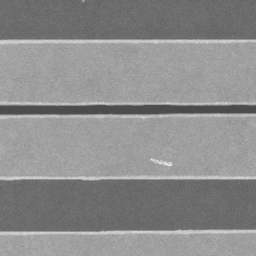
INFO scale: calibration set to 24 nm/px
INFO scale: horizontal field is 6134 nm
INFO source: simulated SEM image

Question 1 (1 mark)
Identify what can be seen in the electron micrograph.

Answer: lines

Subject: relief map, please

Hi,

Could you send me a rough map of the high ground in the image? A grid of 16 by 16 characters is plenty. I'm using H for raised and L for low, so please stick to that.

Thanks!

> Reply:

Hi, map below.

LLLLLLLLLLLLLLLL
LLLLLLLLLLLLLLLL
LLLLLLLLLLLLLLLL
HHHHHHHHHHHHHHHH
HHHHHHHHHHHHHHHH
HHHHHHHHHHHHHHHH
HHHHHHHHHHHHHHHH
HHHHHHHHHHHHHHHH
HHHHHHHHHHHHHHHH
HHHHHHHHHHHHHHHH
HHHHHHHHHHHHHHHH
LLLLLLLLLLLLLLLL
LLLLLLLLLLLLLLLL
LLLLLLLLLLLLLLLL
LLLLLLHHHHHHHHHH
HHHHHHHHHHHHHHHH